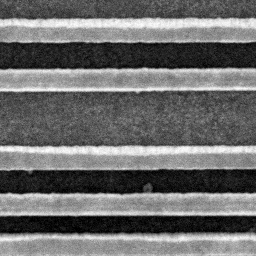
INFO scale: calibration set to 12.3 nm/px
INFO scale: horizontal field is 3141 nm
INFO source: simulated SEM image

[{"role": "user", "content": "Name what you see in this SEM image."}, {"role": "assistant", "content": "lines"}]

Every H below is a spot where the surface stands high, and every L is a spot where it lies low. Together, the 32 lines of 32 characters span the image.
LLLLLLLLLLLLLLLLLLLLLLLLLLLLLLLL
LLLLLLLLLLLLLLLLLLLLLLLLLLLLLLLL
LLLLLLLLLLLLLLLLLLLLLLLLLLLLLLLL
HHHHHHHHHHHHHHHHHHHHHHHHHHHHHHHH
HHHHHHHHHHHHHHHHHHHHHHHHHHHHHHHH
LLLLLLLLLLLLLLLLLLLLLLLLLLLLLLLL
LLLLLLLLLLLLLLLLLLLLLLLLLLLLLLLL
LLLLLLLLLLLLLLLLLLLLLLLLLLLLLLLL
LLLLLLLLLLLLLLLLLLLLLLLLLLLLLLLL
HHHHHHHHHHHHHHHHHHHHHHHHHHHHHHHH
HHHHHHHHHHHHHHHHHHHHHHHHHHHHHHHH
LLLLLLLLLLLLLLLLLLLLLLLLLLLLLLLL
LLLLLLLLLLLLLLLLLLLLLLLLLLLLLLLL
LLLLLLLLLLLLLLLLLLLLLLLLLLLLLLLL
LLLLLLLLLLLLLLLLLLLLLLLLLLLLLLLL
LLLLLLLLLLLLLLLLLLLLLLLLLLLLLLLL
LLLLLLLLLLLLLLLLLLLLLLLLLLLLLLLL
LLLLLLLLLLLLLLLLLLLLLLLLLLLLLLLL
HLLLLLLLLLLLLLLLLLLLLLLLLLLLLLLL
HHHHHHHHHHHHHHHHHHHHHHHHHHHHHHHH
HHHHHHHHHHHHHHHHHHHHHHHHHHHHHHHH
LLLLLLLLLLLLLLLLLLLLLLLLLLLLLLLL
LLLLLLLLLLLLLLLLLLLLLLLLLLLLLLLL
LLLLLLLLLLLLLLLLLLLLLLLLLLLLLLLL
HHHHHHHHHHHHHHHHHHHHHHHHHHHHHHHH
HHHHHHHHHHHHHHHHHHHHHHHHHHHHHHHH
HHHHHHHHHHHHHHHHHHHHHHHHHHHHHHHH
LLLLLLLLLLLLLLLLLLLLLLLLLLLLLLLL
LLLLLLLLLLLLLLLLLLLLLLLLLLLLLLLL
HHHHHHHHHHHHHHHHHHHHHHHHHHHHHHHH
HHHHHHHHHHHHHHHHHHHHHHHHHHHHHHHH
HHHHHHHHHHHHHHHHHHHHHHHHHHHHHHHH